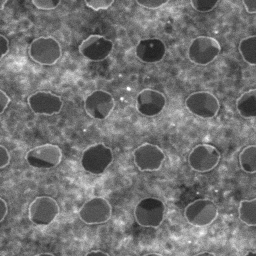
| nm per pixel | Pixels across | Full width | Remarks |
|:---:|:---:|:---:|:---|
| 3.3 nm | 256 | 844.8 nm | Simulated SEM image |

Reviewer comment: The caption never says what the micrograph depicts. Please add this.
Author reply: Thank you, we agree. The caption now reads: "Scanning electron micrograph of a regular array of raised bodies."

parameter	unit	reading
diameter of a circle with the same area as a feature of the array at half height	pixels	28.9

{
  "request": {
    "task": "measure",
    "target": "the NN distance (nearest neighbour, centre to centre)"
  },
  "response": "171 nm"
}